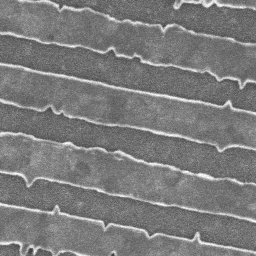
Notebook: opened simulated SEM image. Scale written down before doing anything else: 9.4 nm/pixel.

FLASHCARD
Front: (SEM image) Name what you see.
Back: one or a few lines or trenches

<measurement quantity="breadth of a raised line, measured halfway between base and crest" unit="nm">355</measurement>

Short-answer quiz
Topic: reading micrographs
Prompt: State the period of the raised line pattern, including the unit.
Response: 640 nm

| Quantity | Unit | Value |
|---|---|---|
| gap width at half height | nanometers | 285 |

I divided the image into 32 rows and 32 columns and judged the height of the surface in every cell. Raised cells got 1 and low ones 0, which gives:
11111110000000000000001000011111
11111111111100000000000000000000
11111111111111100000000000000000
11111111111111111111111000000000
00111111111111111111111111100000
00000001111111111111111111111110
00000000000000111111111111111111
00000000000000000011111111111111
11100000000000000000000111111111
11111111000000000000000000011111
11111111111110000000000000000010
11111111111111111100000000000000
11111111111111111111111000000000
00011111111111111111111111111000
00000000111111111111111111111111
00000000000011111111111111111111
00000000000000000001111111111111
11111100000000000000000011111111
11111111110000000000000000010001
11111111111111110000000000000000
11111111111111111110000000000000
11111111111111111111111000000000
00010011111111111111111111111000
00000000000111111111111111111111
00000000000000011111111111111111
00000000000000000000111111111111
11111111000000000000000001111111
11111111111000000000000000000001
11111111111111111000000000000000
11111111111111111111100000000000
00111111111111111111111111000000
00000011011111111111111111111111